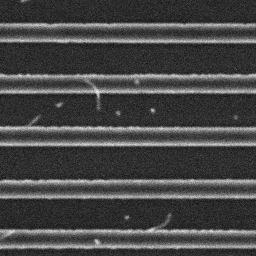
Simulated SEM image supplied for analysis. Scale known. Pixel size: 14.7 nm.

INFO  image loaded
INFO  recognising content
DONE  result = lines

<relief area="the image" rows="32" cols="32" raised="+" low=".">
................................
................................
................................
++++++++++++++++++++++++++++++++
++++++++++++++++++++++++++++++++
................................
................................
................................
................................
++++++++++++++++++++++++++++++++
++++++++++++++++++++++++++++++++
++++++.+...++......+.+....++...+
................................
................................
................................
................................
++++++++++++++++++++++++++++++++
++++++++++++++++++++++++++++++++
................................
................................
................................
................................
........................+...+...
++++++++++++++++++++++++++++++++
++++++++++++++++++++++++++++++++
................................
................................
................................
................................
++++++++++++++++++++++++++++++++
++++++++++++++++++++++++++++++++
................................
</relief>